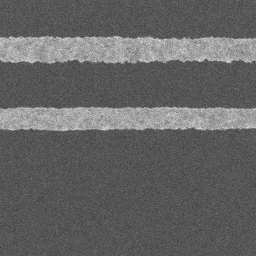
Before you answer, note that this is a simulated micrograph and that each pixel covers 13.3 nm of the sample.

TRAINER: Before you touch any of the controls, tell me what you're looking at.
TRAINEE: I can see one or a few lines or trenches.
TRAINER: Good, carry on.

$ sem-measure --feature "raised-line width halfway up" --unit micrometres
0.287